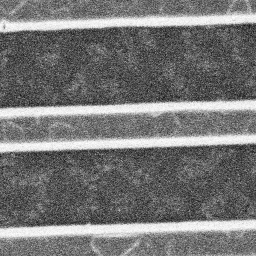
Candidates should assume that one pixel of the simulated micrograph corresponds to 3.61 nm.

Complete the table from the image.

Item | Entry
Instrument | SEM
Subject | one or a few lines or trenches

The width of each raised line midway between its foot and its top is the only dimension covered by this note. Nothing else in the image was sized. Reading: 134 nm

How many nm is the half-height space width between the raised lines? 301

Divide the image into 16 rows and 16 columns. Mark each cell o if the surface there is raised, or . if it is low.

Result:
oooooooooooooooo
oooooo..........
................
................
................
................
................
oooooooooooooooo
oooooooooooooooo
................
................
................
................
................
.ooooooooooooooo
oooooooooooooooo